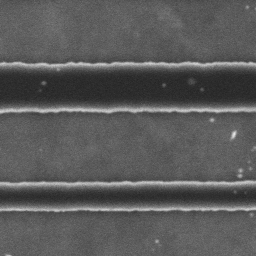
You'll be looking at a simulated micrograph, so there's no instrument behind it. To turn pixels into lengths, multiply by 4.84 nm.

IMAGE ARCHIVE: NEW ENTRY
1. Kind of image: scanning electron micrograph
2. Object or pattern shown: lines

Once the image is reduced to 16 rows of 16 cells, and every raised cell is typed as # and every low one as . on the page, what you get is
................
................
................
................
################
################
################
................
................
................
................
################
################
................
................
................